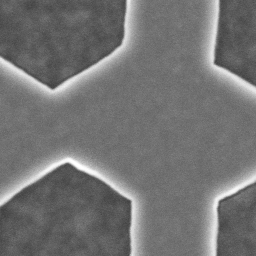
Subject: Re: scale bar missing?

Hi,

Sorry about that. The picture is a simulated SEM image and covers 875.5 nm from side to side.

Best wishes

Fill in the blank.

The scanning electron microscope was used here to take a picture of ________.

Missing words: holes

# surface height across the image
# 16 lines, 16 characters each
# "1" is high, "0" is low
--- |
0000000011111100
0000000011111100
0000000011111000
0000000111111000
1000011111111100
1111111111111111
1111111111111111
1111111111111111
1111111111111111
1111111111111111
1110011111111111
1100000111111111
0000000011111100
0000000011111100
0000000011111100
0000000011111000